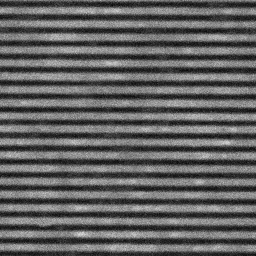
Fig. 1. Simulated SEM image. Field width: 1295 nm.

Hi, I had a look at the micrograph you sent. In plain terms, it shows parallel lines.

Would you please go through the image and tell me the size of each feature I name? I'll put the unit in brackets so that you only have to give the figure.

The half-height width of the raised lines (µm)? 0.0322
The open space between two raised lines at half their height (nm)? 36.7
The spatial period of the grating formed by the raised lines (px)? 13.2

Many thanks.